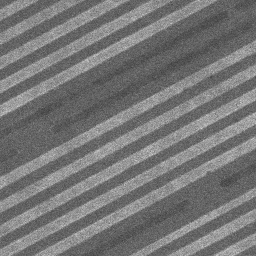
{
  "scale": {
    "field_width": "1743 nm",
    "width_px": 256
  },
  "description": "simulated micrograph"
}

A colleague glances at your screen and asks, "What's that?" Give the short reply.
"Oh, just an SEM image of parallel lines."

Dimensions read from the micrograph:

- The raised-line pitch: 145 nanometers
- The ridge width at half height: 66 nm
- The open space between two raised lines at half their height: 78 nanometres